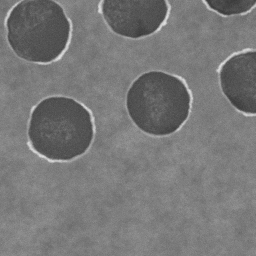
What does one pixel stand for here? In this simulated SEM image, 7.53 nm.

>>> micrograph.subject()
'holes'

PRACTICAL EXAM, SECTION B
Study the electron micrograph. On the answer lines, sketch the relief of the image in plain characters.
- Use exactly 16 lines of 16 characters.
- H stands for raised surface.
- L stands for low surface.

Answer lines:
HLLLHHLLLLHHHLLL
LLLLHHHLLLHHHHHH
HLLLHHHHHHHHHHHH
HLLLHHHHHHHHHHHL
HHHHHHHHHHHHHHLL
HHHHHHHHLLLLHHLL
HHHLLHHHLLLLHHHL
HHLLLLHHLLLLHHHH
HHLLLLHHHHHHHHHH
HHLLLHHHHHHHHHHH
HHHHHHHHHHHHHHHH
HHHHHHHHHHHHHHHH
HHHHHHHHHHHHHHHH
HHHHHHHHHHHHHHHH
HHHHHHHHHHHHHHHH
HHHHHHHHHHHHHHHH